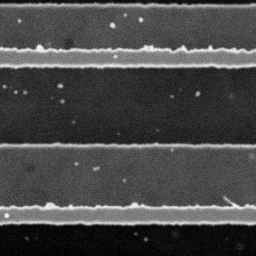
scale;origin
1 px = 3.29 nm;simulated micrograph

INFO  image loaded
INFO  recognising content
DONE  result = lines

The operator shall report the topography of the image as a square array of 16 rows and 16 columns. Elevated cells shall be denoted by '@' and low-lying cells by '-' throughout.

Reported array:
@@@@@@@@@@@@@@@@
@@@@@@@@@@@@@@@@
@@@@@@@@@@@@@@@@
@@@@@@@@@@@@@@@@
----------------
----------------
----------------
----------------
----------------
@@@@@@@@@@@@@@@@
@@@@@@@@@@@@@@@@
@@@@@@@@@@@@@@@@
@@@@@@@@@@@@@@@@
@@@@@@@@@@@@@@@@
----------------
----------------